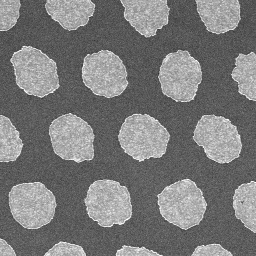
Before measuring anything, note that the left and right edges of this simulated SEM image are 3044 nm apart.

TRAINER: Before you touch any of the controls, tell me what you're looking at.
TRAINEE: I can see a regular array of raised bodies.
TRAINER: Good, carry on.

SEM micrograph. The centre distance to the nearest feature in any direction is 71.2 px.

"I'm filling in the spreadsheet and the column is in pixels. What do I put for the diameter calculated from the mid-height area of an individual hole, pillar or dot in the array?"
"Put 45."